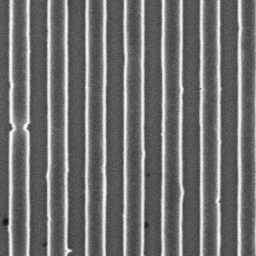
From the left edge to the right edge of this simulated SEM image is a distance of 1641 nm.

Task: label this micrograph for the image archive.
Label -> parallel lines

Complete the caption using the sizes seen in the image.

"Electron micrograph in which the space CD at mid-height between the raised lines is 20 pixels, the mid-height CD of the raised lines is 117 nm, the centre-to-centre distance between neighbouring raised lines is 245 nm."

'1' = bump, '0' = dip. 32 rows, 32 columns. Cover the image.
01100011000110001100111001100011
01100011000110001100111001100011
01100011000110001100111001100011
01100011000110001100111001100011
01100011000110001100111001100011
01110011000110001100111001100011
01110011000110001100111001100011
01100011000110001100111001100011
01100011000110001100111001100011
01100011000110001100111001100011
01100011000110001100111001100011
01110011000110001100111001110011
01100011000110001100111001100011
01100011000110001100111001100011
01100011000110001100111001100011
00100011000110001100111001100011
01100011000110001100111001100011
01100011000110001100111001110011
01100011000110001100111001100011
01100011000110001100111001100011
01100011000110001100111001100011
01100011000110001100111001100011
01100011000110001100111001100011
01100011000110001100111001100011
01100011000110001100111001100011
01110011000110001100111001100011
01110011000110001100111001100011
01110011000110001100111001100011
01110011000110001100111001100011
01110011000110001100111001100011
01110011000110001100111001100011
01100011000110001100111001100011